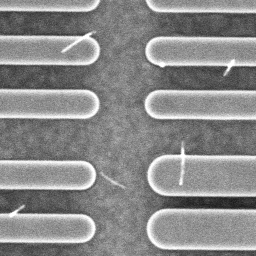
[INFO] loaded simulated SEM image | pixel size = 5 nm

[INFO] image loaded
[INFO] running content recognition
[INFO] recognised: groups of lines, slits or small figures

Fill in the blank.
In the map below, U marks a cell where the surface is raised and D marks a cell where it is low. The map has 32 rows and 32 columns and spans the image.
UUUUUUUUUUUUDDDDDDUUUUUUUUUUUUUU
DDDDDDDDDDDDDDDDDDDDDDDDDDDDDDUU
DDDDDDDDDDDDDDDDDDDDDDDDDDDDDDDD
DDDDDDDDDDDDDDDDDDDDDDDDDDDDDDDD
DDDDDDDDDDDDDDDDDDDDDDDDDDDDDDDD
UUUUUUUUUUUUDDDDDDUUUUUUUUUUUUUU
UUUUUUUUUUUUDDDDDDUUUUUUUUUUUUUU
UUUUUUUUUUUUDDDDDDDUUUUUUUUUUUUU
DDDDDDDDDDDDDDDDDDDDDDDDDDDDDDDD
DDDDDDDDDDDDDDDDDDDDDDDDDDDDDDDD
DDDDDDDDDDDDDDDDDDDDDDDDDDDDDDDD
UUUUUUUUUUUDDDDDDDDUUUUUUUUUUUUU
UUUUUUUUUUUUDDDDDDUUUUUUUUUUUUUU
UUUUUUUUUUUUDDDDDDUUUUUUUUUUUUUU
UUUUUUUUUUUDDDDDDDDUUUUUUUUUUUUU
DDDDDDDDDDDDDDDDDDDDDDDDDDDDDDDD
DDDDDDDDDDDDDDDDDDDDDDDDDDDDDDDD
DDDDDDDDDDDDDDDDDDDDDDDDDDDDDDDD
DDDDDDDDDDDDDDDDDDDDDDDDDDDDDDDD
DDDDDDDDDDDDDDDDDDDDUUUUUDDDDDDD
UUUUUUUUUUUDDDDDDDDUUUUUUUUUUUUU
UUUUUUUUUUUUDDDDDDDUUUUUUUUUUUUU
UUUUUUUUUUUUDDDDDDDUUUUUUUUUUUUU
UUUUUUUUUUUDDDDDDDDUUUUUUUUUUUUU
DDDDDDDDDDDDDDDDDDDDDDDDDDDDDDDD
DDDDDDDDDDDDDDDDDDDDDDDDDDDDDDDD
DDDDDDDDDDDDDDDDDDDDUUUUUUUUUUUU
UUUUUUUUUUUDDDDDDDDUUUUUUUUUUUUU
UUUUUUUUUUUUDDDDDDUUUUUUUUUUUUUU
UUUUUUUUUUUUDDDDDDDUUUUUUUUUUUUU
DDDDDDDDDDDDDDDDDDDUUUUUUUUUUUUU
DDDDDDDDDDDDDDDDDDDDDDDDDDDDDDDD